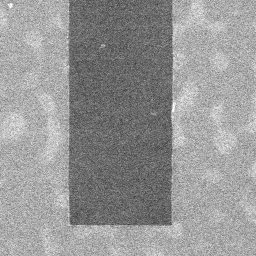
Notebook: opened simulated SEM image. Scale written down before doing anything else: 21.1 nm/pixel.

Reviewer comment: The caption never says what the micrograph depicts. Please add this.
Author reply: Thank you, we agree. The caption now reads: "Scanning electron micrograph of one or a few lines or trenches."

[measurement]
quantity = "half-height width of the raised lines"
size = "104 pixels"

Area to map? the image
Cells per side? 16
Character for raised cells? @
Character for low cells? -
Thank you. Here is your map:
----@@@@@@@-----
----@@@@@@@-----
--@-@@@@@@@-----
----@@@@@@@-----
----@@@@@@@-----
----@@@@@@@-----
----@@@@@@@-----
----@@@@@@@-----
----@@@@@@@-----
----@@@@@@@-----
----@@@@@@@-----
----@@@@@@@-----
----@@@@@@@-----
----@@@@@@@-----
----------------
----------------